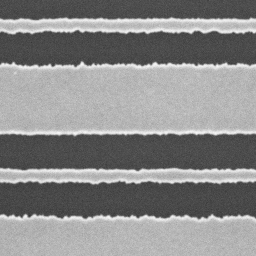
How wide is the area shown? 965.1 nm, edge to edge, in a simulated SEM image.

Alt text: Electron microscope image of lines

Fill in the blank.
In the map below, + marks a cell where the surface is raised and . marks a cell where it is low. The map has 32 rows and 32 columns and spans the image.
................................
................................
++++.+++++++++++++++++++++++++++
++++++++++++++++++++++++++++++++
................................
................................
................................
................................
++++++++++++++++++++++++++++++++
++++++++++++++++++++++++++++++++
++++++++++++++++++++++++++++++++
++++++++++++++++++++++++++++++++
++++++++++++++++++++++++++++++++
++++++++++++++++++++++++++++++++
++++++++++++++++++++++++++++++++
++++++++++++++++++++++++++++++++
++++++++++++++++++++++++++++++++
................................
................................
................................
................................
++++++++++++++++++++++++++++++++
++++++++++++++++++++++++++++++++
................................
................................
................................
................................
++++++++++++++++++++++++++++++++
++++++++++++++++++++++++++++++++
++++++++++++++++++++++++++++++++
++++++++++++++++++++++++++++++++
++++++++++++++++++++++++++++++++